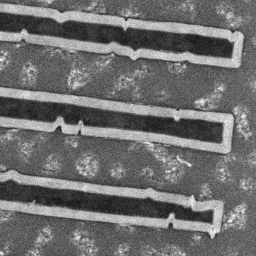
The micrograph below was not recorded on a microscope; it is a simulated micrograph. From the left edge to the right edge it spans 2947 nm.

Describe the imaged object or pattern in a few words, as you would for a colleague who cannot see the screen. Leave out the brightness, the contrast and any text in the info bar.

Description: one or a few lines or trenches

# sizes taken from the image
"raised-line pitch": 967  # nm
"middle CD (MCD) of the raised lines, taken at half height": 0.317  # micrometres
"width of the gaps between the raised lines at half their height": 657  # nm